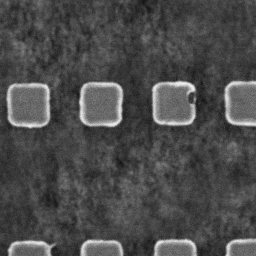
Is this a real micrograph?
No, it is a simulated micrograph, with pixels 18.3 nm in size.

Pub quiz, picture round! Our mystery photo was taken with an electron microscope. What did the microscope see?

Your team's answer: raised bodies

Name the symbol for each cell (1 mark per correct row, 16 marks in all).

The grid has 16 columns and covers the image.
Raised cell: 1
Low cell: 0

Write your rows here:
0000000000000000
0000000000000000
0000000000000000
0000000000000000
0000000000000000
0110011000110011
0110011100110011
0110011000110011
0000000000000000
0000000000000000
0000000000000000
0000000000000000
0000000000000000
0000000000000000
0000000000000000
0110011100110011